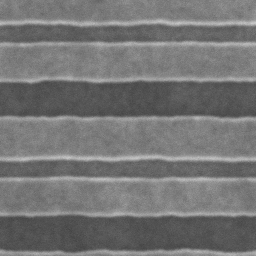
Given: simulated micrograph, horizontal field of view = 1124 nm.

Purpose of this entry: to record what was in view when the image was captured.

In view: lines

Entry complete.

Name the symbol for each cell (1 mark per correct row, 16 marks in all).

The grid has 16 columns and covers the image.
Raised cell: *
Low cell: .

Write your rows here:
****************
****************
****************
****************
****************
................
................
****************
****************
****************
****************
****************
****************
................
................
................